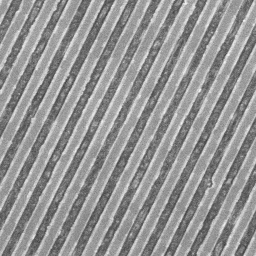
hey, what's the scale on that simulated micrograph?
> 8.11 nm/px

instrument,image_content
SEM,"parallel lines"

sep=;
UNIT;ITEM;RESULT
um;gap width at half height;0.0763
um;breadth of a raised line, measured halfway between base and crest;0.0899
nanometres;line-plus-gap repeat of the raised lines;168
